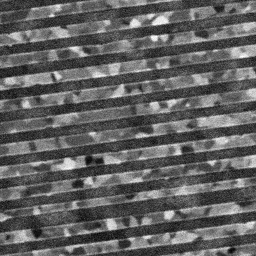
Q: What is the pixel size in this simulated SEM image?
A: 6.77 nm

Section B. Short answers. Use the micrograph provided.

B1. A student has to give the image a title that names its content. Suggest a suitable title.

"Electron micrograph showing parallel lines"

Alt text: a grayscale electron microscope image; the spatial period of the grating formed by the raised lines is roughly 148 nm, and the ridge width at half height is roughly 71.3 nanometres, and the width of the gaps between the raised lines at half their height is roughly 0.0755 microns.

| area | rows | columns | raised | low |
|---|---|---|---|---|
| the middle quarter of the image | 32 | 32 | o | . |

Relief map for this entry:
.........ooooooooooooooooooo....
..ooooooooooooooooooo...........
ooooooooooooo...................
oooooo......................oooo
....................oooooooooooo
.............ooooooooooooooooooo
.....oooooooooooooooooooo.......
oooooooooooooooooo..............
oooooooooo.....................o
oooo....................oooooooo
................oooooooooooooooo
.........oooooooooooooooooooo...
..oooooooooooooooooo............
oooooooooooooo..................
oooooo......................oooo
.....................ooooooooooo
.............ooooooooooooooooooo
.....ooooooooooooooooooo........
oooooooooooooooo................
oooooooooo......................
ooo......................ooooooo
.................ooooooooooooooo
..........ooooooooooooooooooo...
..ooooooooooooooooooo...........
oooooooooooooo..................
oooooo......................oooo
.....................ooooooooooo
.............ooooooooooooooooooo
......ooooooooooooooooooo.......
ooooooooooooooooo...............
oooooooooo......................
oo.......................ooooooo